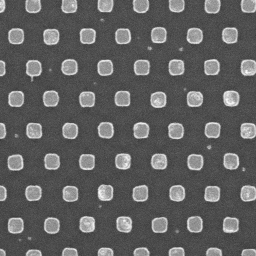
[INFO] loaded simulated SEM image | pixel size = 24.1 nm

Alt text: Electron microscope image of a regular array of raised bodies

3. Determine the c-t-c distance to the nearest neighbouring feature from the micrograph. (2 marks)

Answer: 847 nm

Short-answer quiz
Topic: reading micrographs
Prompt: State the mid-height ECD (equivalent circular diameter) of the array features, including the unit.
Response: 386 nm